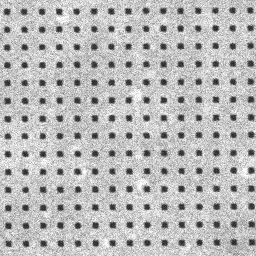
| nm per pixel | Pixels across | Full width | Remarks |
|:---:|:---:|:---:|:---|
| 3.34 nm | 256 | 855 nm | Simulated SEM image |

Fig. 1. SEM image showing a regular array of holes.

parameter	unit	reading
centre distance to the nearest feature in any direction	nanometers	57.5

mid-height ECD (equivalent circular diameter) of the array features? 22.3 nanometres